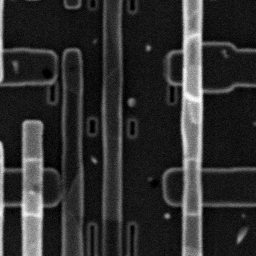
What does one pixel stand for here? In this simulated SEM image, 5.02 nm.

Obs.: wiring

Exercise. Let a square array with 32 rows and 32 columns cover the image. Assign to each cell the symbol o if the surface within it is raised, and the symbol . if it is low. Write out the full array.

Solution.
........oo...oo........oo.......
.............oo........oo.......
.............oo........oo.......
.............oo........oo.......
.............oo........oo.......
.............oo........oooooo...
ooooooo.oo...oo......ooooooooooo
ooooooo.oo...oo......ooooooooooo
ooooooo.oo...oo......ooooooooooo
ooooooo.oo...oo......ooooooooooo
oooo....oo...oo......ooooooooooo
........oo...oo........ooo......
........oo...oo........oo.......
........oo...oo........oo.......
........oo...oo........oo.......
...oo...oo...oo........oo.......
...oo...oo...oo........oo.......
...oo...oo...oo........oo.......
...oo...oo...oo........oo.......
...oo...oo...oo........oo.......
...oo...oo...oo........oo.......
ooooooo.oo...oo......ooooooooooo
oooooooooo...oo......ooooooooooo
oooooooooo...oo......ooooooooooo
oooooooooo...oo......ooooooooooo
ooooooo.oo...oo.......oooooooooo
...oo...oo...oo........oo.......
...oo...oo...oo........oo.......
...oo...oo...oo........oo.......
...oo...oo...oo........oo.......
...oo...oo...oo........oo.......
...oo...oo...oo........oo.......